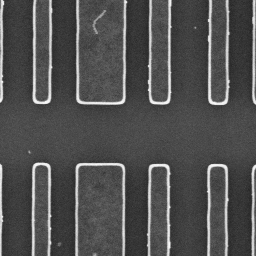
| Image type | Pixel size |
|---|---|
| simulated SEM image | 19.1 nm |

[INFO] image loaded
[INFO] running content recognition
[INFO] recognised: groups of lines, slits or small figures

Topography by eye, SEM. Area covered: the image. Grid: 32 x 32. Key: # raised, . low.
....##....######...##.....##....
....##....######...##.....##....
....##....######...##.....##....
....##....######...##.....##....
....##....######...##.....##....
....##....#####....##.....##....
....##....#####....##.....##....
....##....#####....##.....##....
....##....######...##.....##....
....##....#####....##.....##....
....##....#####....##.....##....
....##....#####....##.....##....
....##....#####....##.....##....
................................
................................
................................
................................
................................
................................
................................
................................
....##....#####....##.....##....
....##....#####....##.....##....
....##....#####....##.....##....
....##....#####....##.....##....
....##....#####....##.....##....
....##....#####....##.....##....
....##....#####....##.....##....
....##....#####....##.....##....
....##....#####....##.....##....
....##....#####....##.....##....
....##....#####....##.....##....